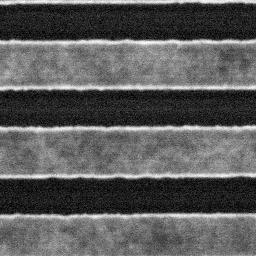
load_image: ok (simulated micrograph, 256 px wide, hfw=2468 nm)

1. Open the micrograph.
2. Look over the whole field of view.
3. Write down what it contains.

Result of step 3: lines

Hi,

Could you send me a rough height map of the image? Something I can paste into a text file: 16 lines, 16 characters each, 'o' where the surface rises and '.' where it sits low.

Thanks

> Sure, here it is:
................
................
................
oooooooooooooooo
oooooooooooooooo
oooooooooooooooo
................
................
oooooooooooooooo
oooooooooooooooo
oooooooooooooooo
................
................
oooooooooooooooo
oooooooooooooooo
oooooooooooooooo